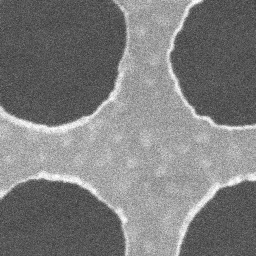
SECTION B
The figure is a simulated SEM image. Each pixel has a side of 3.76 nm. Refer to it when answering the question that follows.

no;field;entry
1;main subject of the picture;holes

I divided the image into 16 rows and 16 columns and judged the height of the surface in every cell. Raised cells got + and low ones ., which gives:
........++++....
........+++.....
........+++.....
........+++.....
.......++++.....
.......++++.....
......++++++....
+....++++++++...
++++++++++++++++
++++++++++++++++
++++++++++++++++
+....+++++++++..
......+++++++...
.......+++++....
........++++....
........+++.....